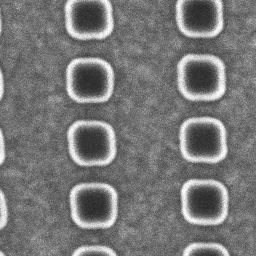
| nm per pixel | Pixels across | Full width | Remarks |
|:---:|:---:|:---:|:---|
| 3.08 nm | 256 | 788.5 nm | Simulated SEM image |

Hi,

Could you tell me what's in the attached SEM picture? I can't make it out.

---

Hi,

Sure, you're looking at raised bodies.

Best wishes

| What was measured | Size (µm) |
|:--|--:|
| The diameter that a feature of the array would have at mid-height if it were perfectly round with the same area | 0.14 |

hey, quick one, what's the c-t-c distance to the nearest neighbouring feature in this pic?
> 192 nm